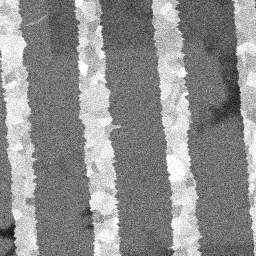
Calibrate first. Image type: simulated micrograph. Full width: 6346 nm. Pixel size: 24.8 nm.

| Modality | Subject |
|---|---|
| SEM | one or a few lines or trenches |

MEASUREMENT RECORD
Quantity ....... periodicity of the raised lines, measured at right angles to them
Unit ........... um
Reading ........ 1.95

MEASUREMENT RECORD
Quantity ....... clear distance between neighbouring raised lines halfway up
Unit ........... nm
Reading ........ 1350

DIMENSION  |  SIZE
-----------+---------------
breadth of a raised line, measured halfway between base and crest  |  0.593 µm